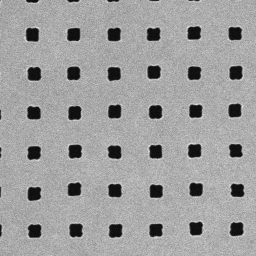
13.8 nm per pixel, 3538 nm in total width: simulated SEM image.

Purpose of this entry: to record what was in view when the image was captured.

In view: a regular array of holes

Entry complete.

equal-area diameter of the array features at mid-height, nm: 199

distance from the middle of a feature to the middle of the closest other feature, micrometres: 0.537